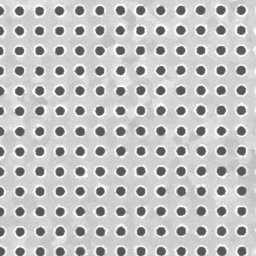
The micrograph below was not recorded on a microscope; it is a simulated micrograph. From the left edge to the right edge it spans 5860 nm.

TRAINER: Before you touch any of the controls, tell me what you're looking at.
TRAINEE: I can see a regular array of holes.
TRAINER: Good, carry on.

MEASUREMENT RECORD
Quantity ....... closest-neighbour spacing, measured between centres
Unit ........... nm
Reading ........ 449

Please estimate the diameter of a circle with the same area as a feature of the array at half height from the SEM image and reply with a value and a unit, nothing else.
225 nanometres